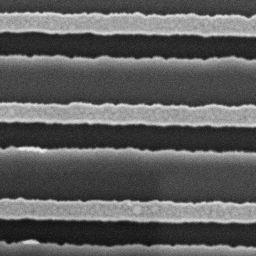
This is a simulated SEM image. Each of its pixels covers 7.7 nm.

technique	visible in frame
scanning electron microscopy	lines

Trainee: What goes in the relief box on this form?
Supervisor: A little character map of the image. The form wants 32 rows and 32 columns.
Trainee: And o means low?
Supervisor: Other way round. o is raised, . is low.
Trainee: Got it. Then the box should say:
oooooooooooooooooooooooooooooooo
oooooooooooooooooooooooooooooooo
oooooooooooooooooooooooooooooooo
oooooooooooooooooooooooooooooooo
................................
................................
................................
ooooooooooooooooooooooooo.ooooo.
oooooooooooooooooooooooooooooooo
oooooooooooooooooooooooooooooooo
oooooooooooooooooooooooooooooooo
oooooooooooooooooooooooooooooooo
oooooooooooooooooooooooooooooooo
oooooooooooooooooooooooooooooooo
oooooooooooooooooooooooooooooooo
...................oo.oooooooooo
................................
................................
.oooo...........................
oooooooooooooooooooooooooooooooo
oooooooooooooooooooooooooooooooo
oooooooooooooooooooooooooooooooo
oooooooooooooooooooooooooooooooo
oooooooooooooooooooooooooooooooo
oooooooooooooooooooooooooooooooo
oooooooooooooooooooooooooooooooo
oooooooooooooooooooooooooooooooo
............ooo.oooooooooooooooo
................................
................................
ooooo...........................
oooooooooooooooooooooooooooooooo